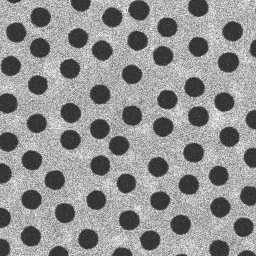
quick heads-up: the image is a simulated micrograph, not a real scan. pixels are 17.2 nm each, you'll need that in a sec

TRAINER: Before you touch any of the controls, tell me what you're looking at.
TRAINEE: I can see a regular array of holes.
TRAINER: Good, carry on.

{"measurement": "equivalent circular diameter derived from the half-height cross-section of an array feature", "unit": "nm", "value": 350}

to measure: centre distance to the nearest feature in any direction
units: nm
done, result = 527